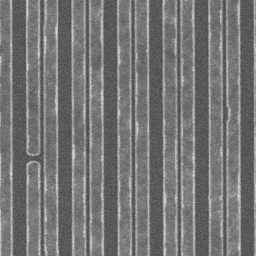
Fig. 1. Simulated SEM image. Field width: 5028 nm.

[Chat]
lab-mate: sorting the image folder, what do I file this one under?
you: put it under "parallel lines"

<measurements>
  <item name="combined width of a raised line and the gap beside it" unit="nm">437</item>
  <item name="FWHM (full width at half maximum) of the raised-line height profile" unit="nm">248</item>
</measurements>